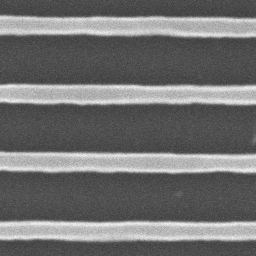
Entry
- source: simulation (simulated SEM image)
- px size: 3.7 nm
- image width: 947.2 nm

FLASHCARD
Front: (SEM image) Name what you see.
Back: lines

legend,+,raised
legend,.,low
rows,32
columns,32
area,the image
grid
................................
................................
++++++++++++++++++++++++++++++++
++++++++++++++++++++++++++++++++
................................
................................
................................
................................
................................
................................
................................
++++++++++++++++++++++++++++++++
++++++++++++++++++++++++++++++++
................................
................................
................................
................................
................................
................................
++++++++++++++++++++++++++++++++
++++++++++++++++++++++++++++++++
................................
................................
................................
................................
................................
................................
................................
++++++++++++++++++++++++++++++++
++++++++++++++++++++++++++++++++
................................
................................